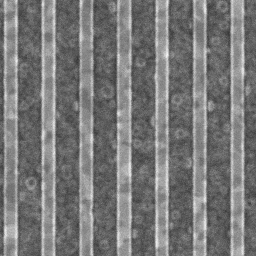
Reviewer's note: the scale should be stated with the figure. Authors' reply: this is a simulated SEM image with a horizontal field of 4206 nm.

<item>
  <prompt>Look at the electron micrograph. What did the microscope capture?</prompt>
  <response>parallel lines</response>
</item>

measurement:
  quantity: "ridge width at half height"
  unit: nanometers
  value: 195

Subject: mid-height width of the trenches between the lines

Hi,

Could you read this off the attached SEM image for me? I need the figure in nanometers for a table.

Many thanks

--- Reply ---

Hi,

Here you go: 419